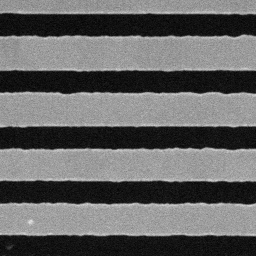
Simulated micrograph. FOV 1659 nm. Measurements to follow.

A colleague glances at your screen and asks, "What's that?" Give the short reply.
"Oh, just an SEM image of lines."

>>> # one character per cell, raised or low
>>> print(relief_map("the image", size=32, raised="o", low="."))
oooooooooooooooooooooooooooooooo
oooooooooooooooooooooooooooooooo
................................
................................
..............................o.
oooooooooooooooooooooooooooooooo
oooooooooooooooooooooooooooooooo
oooooooooooooooooooooooooooooooo
oooooooooooooooooooooooooooooooo
................................
................................
...o............................
oooooooooooooooooooooooooooooooo
oooooooooooooooooooooooooooooooo
oooooooooooooooooooooooooooooooo
oooooooooooooooooooooooooooooooo
................................
................................
................................
oooooooooooooooooooooooooooooooo
oooooooooooooooooooooooooooooooo
oooooooooooooooooooooooooooooooo
oooooooooooooooooooooooooooooooo
................................
................................
.ooo.oooo.oo....oo.o...ooo.oo...
oooooooooooooooooooooooooooooooo
oooooooooooooooooooooooooooooooo
oooooooooooooooooooooooooooooooo
................................
................................
................................